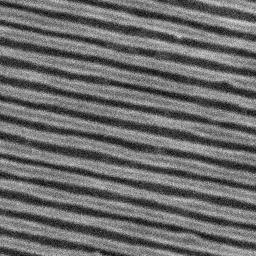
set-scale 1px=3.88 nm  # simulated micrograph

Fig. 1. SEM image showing parallel lines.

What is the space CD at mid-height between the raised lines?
35.6 nm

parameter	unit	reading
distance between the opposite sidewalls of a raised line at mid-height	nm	35.6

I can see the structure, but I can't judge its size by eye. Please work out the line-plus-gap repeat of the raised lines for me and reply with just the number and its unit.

0.0721 µm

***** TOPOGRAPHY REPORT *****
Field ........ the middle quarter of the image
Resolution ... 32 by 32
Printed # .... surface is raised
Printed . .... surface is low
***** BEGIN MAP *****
##########.........############.
#############............#######
......#############...........##
...........############.........
###............#############....
#########...........############
.###############..........######
.......##############.........##
...........###############......
#####...........#############...
##########............##########
...############.............####
........############............
##...........###########........
######............#############.
##########...............#######
....###########...............##
.........############...........
####...........###########......
########...........############.
.############...........########
.......#########...............#
...........#########............
##.............#############....
########...........#############
...########.............########
......############............##
##.........############.........
#######.........#############...
############...........#########
......#########.............####
...........########.............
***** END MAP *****